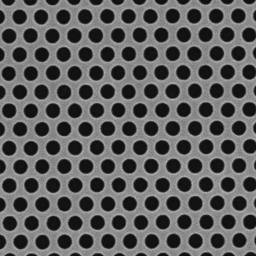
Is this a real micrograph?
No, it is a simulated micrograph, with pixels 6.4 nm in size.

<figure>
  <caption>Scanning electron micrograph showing a regular array of holes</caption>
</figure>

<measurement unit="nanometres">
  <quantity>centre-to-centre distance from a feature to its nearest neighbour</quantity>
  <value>137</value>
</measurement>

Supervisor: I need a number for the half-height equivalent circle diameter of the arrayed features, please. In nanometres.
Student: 95.3